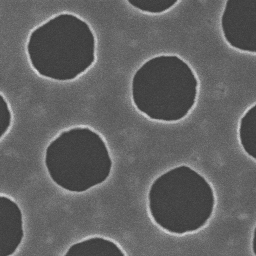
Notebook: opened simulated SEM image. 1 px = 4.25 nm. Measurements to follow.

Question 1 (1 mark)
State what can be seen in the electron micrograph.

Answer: holes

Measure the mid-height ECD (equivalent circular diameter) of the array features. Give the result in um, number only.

0.275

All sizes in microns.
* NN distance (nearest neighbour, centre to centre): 0.469